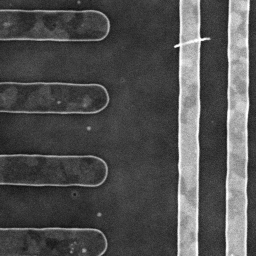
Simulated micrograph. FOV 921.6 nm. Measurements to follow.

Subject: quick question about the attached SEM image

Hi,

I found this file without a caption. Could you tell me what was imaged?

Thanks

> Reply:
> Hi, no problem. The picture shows groups of lines, slits or small figures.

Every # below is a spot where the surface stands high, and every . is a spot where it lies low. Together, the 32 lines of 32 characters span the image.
.......................##....##.
############...........##....##.
##############.........##....##.
##############.........##....##.
#############..........##....##.
......................###....##.
.......................##....##.
.......................##....##.
.......................##....##.
.......................##....##.
########...............##....##.
#############..........##....##.
##############.........##....##.
#############..........##....##.
......................###...###.
......................###...###.
......................###...###.
......................###...###.
......................###...###.
######.................##...###.
#############.........###...###.
#############.........###...###.
#############.........###...###.
......................###...###.
......................###...###.
......................###...###.
......................###...###.
......................###...###.
......................###...###.
#############.........###...###.
#############.........###...###.
#############.........###...###.